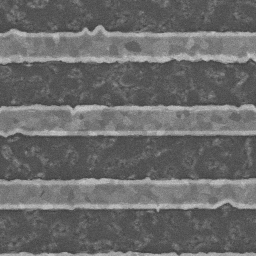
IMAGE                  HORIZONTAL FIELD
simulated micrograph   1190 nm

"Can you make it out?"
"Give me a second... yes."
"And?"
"one or a few lines or trenches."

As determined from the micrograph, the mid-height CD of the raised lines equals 117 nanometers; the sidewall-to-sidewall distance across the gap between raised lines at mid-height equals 227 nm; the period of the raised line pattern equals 73.8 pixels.